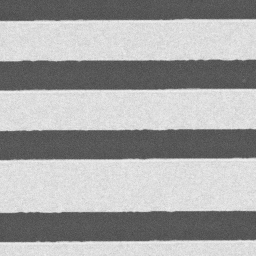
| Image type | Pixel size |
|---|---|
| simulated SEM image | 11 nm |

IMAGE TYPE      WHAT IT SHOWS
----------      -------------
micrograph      lines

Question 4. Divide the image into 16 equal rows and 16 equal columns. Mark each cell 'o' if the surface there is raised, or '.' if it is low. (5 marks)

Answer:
................
oooooooooooooooo
oooooooooooooooo
oooooooooooooooo
................
................
oooooooooooooooo
oooooooooooooooo
................
................
oooooooooooooooo
oooooooooooooooo
oooooooooooooooo
................
................
oooooooooooooooo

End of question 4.